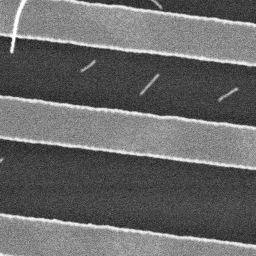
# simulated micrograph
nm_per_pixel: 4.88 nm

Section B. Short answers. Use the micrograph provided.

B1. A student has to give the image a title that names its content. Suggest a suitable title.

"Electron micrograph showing lines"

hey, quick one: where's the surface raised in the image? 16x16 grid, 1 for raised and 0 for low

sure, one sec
1111111100000000
1111111111111111
0001111111111111
0000000000011111
0000000000000000
0000000000000000
1111000000000000
1111111111110000
1111111111111111
0000000111111111
0000000000000001
0000000000000000
0000000000000000
1000000000000000
1111111110000000
1111111111111111